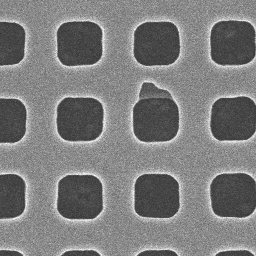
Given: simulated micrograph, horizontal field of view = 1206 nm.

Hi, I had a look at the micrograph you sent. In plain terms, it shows holes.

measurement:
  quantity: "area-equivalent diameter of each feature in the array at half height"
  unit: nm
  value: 229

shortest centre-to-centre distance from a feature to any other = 358 nm